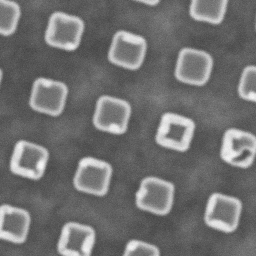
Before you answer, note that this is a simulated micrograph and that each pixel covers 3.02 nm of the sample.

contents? a regular array of raised bodies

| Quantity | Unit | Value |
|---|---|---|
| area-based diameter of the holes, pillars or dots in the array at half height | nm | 110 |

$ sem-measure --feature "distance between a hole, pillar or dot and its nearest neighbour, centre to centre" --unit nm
199